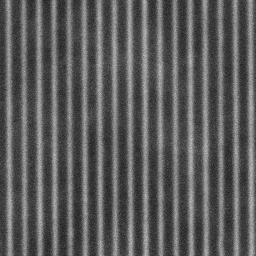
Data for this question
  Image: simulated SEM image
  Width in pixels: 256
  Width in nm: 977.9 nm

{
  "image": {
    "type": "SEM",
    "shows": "parallel lines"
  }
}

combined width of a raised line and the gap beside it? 57.8 nm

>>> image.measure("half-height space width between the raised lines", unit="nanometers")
46.8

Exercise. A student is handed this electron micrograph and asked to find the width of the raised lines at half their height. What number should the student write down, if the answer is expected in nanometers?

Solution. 13.4